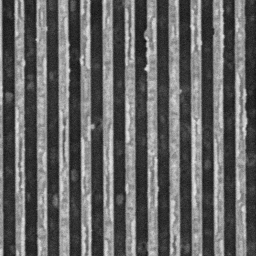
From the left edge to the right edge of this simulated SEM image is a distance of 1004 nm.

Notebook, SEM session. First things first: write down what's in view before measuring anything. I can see parallel lines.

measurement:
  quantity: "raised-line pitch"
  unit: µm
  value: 0.0865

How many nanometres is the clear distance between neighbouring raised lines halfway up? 50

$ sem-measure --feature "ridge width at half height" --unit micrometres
0.0348